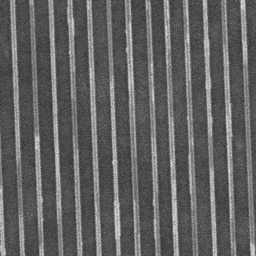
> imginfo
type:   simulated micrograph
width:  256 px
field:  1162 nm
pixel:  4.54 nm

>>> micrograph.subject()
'parallel lines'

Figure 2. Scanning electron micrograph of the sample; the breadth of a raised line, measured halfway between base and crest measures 0.0199 micrometres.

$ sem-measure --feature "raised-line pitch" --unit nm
87.2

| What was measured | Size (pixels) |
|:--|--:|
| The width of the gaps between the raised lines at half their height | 14.8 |